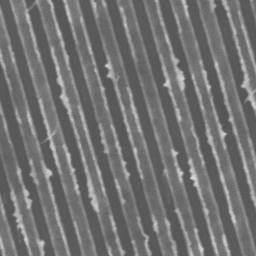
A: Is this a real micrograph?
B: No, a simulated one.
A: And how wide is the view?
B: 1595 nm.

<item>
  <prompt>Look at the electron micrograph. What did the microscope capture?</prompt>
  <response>parallel lines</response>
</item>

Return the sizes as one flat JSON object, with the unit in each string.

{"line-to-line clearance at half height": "72.7 nm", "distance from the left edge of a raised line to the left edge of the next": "0.16 µm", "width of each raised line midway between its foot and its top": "89.2 nm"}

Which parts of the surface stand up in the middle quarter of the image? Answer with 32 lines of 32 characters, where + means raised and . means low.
+...++++..+++++...+++...++++...+
++...+++...++++...++++...++++..+
++...++++..++++....+++...+++++..
++...++++...++++...+++...+++++..
+++...+++...++++...+++...+++++..
+++...++++..++++...++++..+++++..
+++...++++...++++...+++...++++..
+++...++++...++++...+++...++++..
++++...+++....+++...++++...+++..
++++...++++...+++....+++...++++.
++++...++++...++++...+++...++++.
.++++...+++...++++...++++...+++.
.++++...+++....+++...++++...++++
.++++...++++...++++...+++...++++
..+++...++++...++++...+++....+++
..++++...+++....+++...++++...+++
...+++...++++...+++....+++...+++
...+++...++++...++++...+++....++
...++++..++++...++++...++++...++
...++++..+++++...+++...++++...++
+...+++...++++...++++...+++...++
+...+++...++++...++++...++++...+
+...++++...+++....+++...++++...+
++..++++...++++...+++....+++...+
++...+++...++++...++++...+++...+
++...++++...+++...++++...++++...
+++..++++...++++...+++...++++...
+++...+++...++++...++++..+++++..
+++...+++...++++...++++...+++...
+++...++++...+++....+++...++++..
++++..++++...++++...+++....+++..
++++..++++...++++...++++...+++..